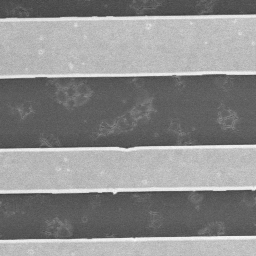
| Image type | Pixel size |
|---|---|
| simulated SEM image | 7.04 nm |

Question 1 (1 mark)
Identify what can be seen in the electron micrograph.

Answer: one or a few lines or trenches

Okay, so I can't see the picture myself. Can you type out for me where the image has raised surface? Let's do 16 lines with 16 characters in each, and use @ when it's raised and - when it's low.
----------------
@@@@@@@@@@@@@@@@
@@@@@@@@@@@@@@@@
@@@@@@@@@@@@@@@@
@@@@@@@@@@@@@@@@
----------------
----------------
----------------
----------------
@@@@@@@@@@@@@@@@
@@@@@@@@@@@@@@@@
@@@@@@@@@@@@@@@@
----------------
----------------
----------------
@@@@@@@@@@@@@@@@